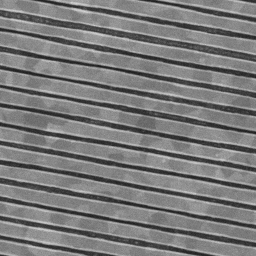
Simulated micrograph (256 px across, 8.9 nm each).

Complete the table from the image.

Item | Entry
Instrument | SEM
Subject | parallel lines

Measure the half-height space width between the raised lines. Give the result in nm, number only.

52.6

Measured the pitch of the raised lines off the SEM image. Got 18.5 px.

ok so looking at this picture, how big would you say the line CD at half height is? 113 nanometers